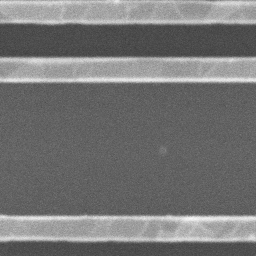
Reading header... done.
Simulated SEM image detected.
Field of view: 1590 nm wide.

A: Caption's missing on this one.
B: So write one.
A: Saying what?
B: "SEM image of lines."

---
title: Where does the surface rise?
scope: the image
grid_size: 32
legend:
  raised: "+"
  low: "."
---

++++++++++++++++++++++++++++++++
++++++++++++++++++++++++++++++++
++++++++++++++++++++++++++++++++
................................
................................
................................
................................
++++++++++++++++++++++++++++++++
++++++++++++++++++++++++++++++++
++++++++++++++++++++++++++++++++
................................
................................
................................
................................
................................
................................
................................
................................
................................
................................
................................
................................
................................
................................
................................
................................
................................
++++++++++++++++++++++++++++++++
++++++++++++++++++++++++++++++++
++++++++++++++++++++++++++++++++
................................
................................